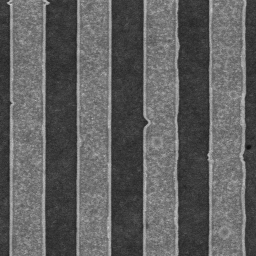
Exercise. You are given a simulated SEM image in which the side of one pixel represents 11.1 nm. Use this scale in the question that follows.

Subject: one or a few lines or trenches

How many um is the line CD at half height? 0.363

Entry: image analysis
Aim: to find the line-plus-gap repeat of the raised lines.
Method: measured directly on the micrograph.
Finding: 0.734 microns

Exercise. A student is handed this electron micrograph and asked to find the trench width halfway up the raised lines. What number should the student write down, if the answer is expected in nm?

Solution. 374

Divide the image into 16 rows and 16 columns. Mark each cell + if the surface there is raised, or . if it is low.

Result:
.++..++..++..++.
.++..++..++..++.
.++..++..++..++.
.++..++..++..++.
.++..++..++..++.
.++..++..++..++.
.++..++..++..++.
.++..++..++..++.
.++..++..++..++.
.++..++..++..++.
.++..++..++..++.
.++..++..++..++.
.++..++..++..++.
.++..++..++..++.
.++..++..++..++.
.++..++..++..++.